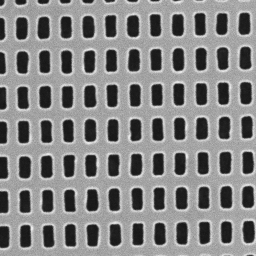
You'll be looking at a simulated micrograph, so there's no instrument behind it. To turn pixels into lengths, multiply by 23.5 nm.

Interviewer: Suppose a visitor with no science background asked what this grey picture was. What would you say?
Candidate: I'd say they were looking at a regular array of holes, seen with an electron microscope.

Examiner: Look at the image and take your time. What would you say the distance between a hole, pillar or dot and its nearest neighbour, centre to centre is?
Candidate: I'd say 0.517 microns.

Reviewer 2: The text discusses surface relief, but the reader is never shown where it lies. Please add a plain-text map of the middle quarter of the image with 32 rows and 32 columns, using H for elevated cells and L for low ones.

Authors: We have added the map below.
LLHHHLLLHHLLLHHHLLLHHHLLLHHLLLHH
LLHHHLLLHHHLLHHHLLLHHHLLHHHHLLHH
LHHHHHHHHHHHHHHHHHHHHHHHHHHHHHHH
HHHHHHHHHHHHHHHHHHHHHHHHHHHHHHHH
HHHHHHHHHHHHHHHHHHHHHHHHHHHHHHHH
LLHHHLLLHHHLLHHHLLLHHHLLLHHLLLHH
LLHHHLLLHHLLLLHHLLLHHHLLLHHLLLHH
LLHHHLLLHHHLLLHHLLLHHHLLLHHLLLHH
LLHHHLLLHHHLLLHHLLLHHHLLLHHLLLHH
LLHHHLLLHHHLLLHHLLLHHHLLLHHLLLHH
LLHHHLLLHHHLLHHHHLLHHHLLHHHHLHHH
HHHHHHHHHHHHHHHHHHHHHHHHHHHHHHHH
HHHHHHHHHHHHHHHHHHHHHHHHHHHHHHHH
HHHHHHHHHHHHHHHHHLHHHHHLHHHHLLHH
LLHHHLLLHHHLLLHHLLLHHHLLLHHLLLHH
LLLHHLLLHHHLLLHHLLLHHHLLLHHLLLHH
LLLHHLLLHHHLLLHHLLLHHHLLLHHLLLHH
LLLHHLLLHHHLLLHHHLLLHHLLLHHLLLHH
LLLHHLLLHHHLLLHHLLLHHHLLLHHHLLHH
LLHHHHLHHHHLLHHHHHHHHHHHHHHHHHHH
HHHHHHHHHHHHHHHHHHHHHHHHHHHHHHHH
HHHHHHHHHHHHHHHHHHHHHHHHHHHHHHHH
HHHHHHHHHHHHLHHHHLLHHHHLLHHHLLHH
LLLHHLLLHHHLLLHHHLLLHHLLLHHLLLLH
LLLHHLLLHHHLLLHHHLLLHHLLLHHHLLLH
LLLHHLLLHHHLLLHHHLLLHHLLLHHHLLLH
LLLHHLLLHHHLLLHHHLLLHHLLLHHHLLHH
LLLHHLLLHHHLLLHHHLLHHHLLLHHHLLHH
HHHHHHHHHHHHHHHHHHHHHHHHHHHHHHHH
HHHHHHHHHHHHHHHHHHHHHHHHHHHHHHHH
HHHHHHHHHHHHHHHHHHHHHHHHHHHHHHHH
HLHHHHLLHHHLLLHHHLLLHHLLLHHHLLLH